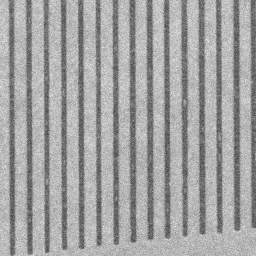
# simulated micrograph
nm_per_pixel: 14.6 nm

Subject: parallel lines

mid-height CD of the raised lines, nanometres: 166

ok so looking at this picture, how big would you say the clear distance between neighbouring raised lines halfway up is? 0.0878 µm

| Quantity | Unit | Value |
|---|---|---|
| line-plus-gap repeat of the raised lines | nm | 253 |